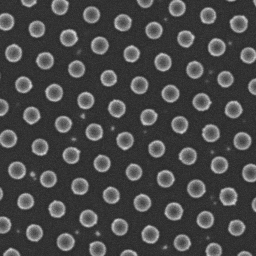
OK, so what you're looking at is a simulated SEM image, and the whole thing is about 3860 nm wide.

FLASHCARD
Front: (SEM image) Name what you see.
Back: a regular array of raised bodies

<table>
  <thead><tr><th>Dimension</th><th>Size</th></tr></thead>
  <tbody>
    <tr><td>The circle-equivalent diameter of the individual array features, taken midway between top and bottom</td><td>246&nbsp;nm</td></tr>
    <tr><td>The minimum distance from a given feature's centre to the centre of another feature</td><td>31.9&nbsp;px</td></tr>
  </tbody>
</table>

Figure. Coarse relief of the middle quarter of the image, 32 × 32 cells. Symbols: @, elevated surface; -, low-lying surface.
-@@@@------------------@@@@----@
-@@@@-------------------@@-----@
--@@@-----@@@------------------@
---------@@@@-----@@------------
----------@@@----@@@@-----------
-----------------@@@@-----@-----
-----------------@@@-----@@@----
----@@-------------------@@@@---
----@@@------------------@@@----
----@@@-----@@------------@-----
----@@@----@@@@-----------------
-----------@@@@-----@-----------
------------@@@----@@@@---------
@------------------@@@@-----@@--
@@------------------@@@----@@@@-
@@----@@@------------------@@@@-
@-----@@@-------------------@@@-
------@@@-----@@@---------------
------@@@----@@@@---------------
-------------@@@@-----@@--------
--------------@@@----@@@@-------
-@@------------------@@@@-----@@
@@@@------------------@@@----@@@
@@@@----@@@------------------@@@
-@@-----@@@-------------------@@
--------@@@-----@@--------------
--------@@@-----@@@-------------
----------------@@@-----@@@-----
----------------@@@-----@@@-----
--@@@@------------------@@@-----
--@@@@-------------------@-----@
--@@@@----@@@------------------@